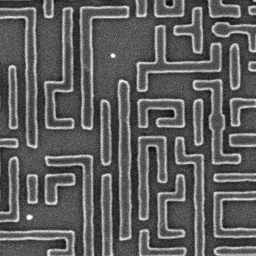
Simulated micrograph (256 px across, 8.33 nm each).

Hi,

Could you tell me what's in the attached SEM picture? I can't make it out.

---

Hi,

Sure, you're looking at wiring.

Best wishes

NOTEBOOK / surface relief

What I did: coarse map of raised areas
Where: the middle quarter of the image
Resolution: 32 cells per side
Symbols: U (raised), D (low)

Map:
UUDDDUUDDDDDDDDDDDUUUUUUUUUUUUUU
UUDDDUUDDDDDDDDDDDDUUUUUUUUUUUUU
UUDDDUUDDDDDDDDDDDDUUDDDDDDDDDDD
UUDDDUUDDDDDDDDDDDDUUDDDDDDDDDDD
UUDDDUUDDDDDDDUUDDDUUDDDDDDDDDDD
UUDDDUUDDDDDDDUUDDUUUDDDDDDDDDDD
UUDDDUUDDDDDDDUUDDDUDDDDDDDDDDDD
DDDDDUUDDDDDDDUUDDDDDDDDDDDDDDDD
DDDDDUUDDDDDDDUUDDDDDDDDDDDDDDDD
DDDDDUUDDUUDDDUUDDDUUUUUUUUUUUDD
DDDDDUUDDUUDDDUUDDDUUUUUUUUUUUDD
DDDDDUUDDUUDDDUUDDDUUDDDDDDUUUDD
DDDDDUUDDUUDDDUUDDDUUDDDDDDDUUDD
DDDDDUUDDUUDDDUUDDDUUDDDDDDUUUDD
UUDDDUUDDUUDDDUUDDDUUDDUUUUUUUDD
UUDDDUUDDUUDDDUUDDDUUDDUUUUUUUDD
DDDDDDDDDUUUDDUUDDDDDDDDDDDDDDDD
DDDDDDDDDUUUDDUUDDDDDDDDDDDDDDDD
DDDDDDDDDUUUDDUUDDDUUUUUUDDDUUDD
DDDDDDDDDUUUDDUUDDDUUUUUUDDDUUDD
DDDDDDDDDUUUDDUUDDDUUDDUUDDDUUDD
DDDDDDDDDUUUDDUUDDDUUDDUUDDDUUDD
DDDDDDDDDUUUDDUUDDDUUDDUUDDDUUDD
UUUUUUUDDUUUDDUUDDDUUDDUUDDDUUUU
UUUUUUUDDUUUDDUUDDDUUDDUUDDDUUUU
DDDDUUUDDDDDDDUUDDDUUDDDUDDDDDDD
DDDDDUUDDDDDDDUUDDDUUDDDUDDDDDDD
DDDDDUUDDDDDDDUUDDDUUDDDUUDDDDDD
UUDDDUUDDDUUDDUUDDDUUDDDUUDDUUDD
UUDDDUUDDDUUDDUUDDDUUDDDUDDDUUDD
DDDDDUUDDDUUDDUUDDDUUDDDDDDDUUDD
DDDDDUUDDDUUDDUUDDDUUDDDDDDDUUDD